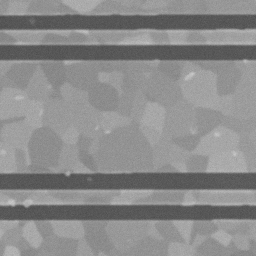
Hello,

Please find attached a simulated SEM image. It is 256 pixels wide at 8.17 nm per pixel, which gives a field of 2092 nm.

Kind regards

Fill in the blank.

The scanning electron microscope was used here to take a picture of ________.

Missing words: lines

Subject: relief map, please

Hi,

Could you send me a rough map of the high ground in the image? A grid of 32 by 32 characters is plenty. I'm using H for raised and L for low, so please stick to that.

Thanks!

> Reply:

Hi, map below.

HHHHHHHHHHHHHHHHHHHHHHHHHHHHHHHH
HHHHHHHHHHHHHHHHHHHHHHHHHHHHHHHH
LLLLLLLLLLLLLLLLLLLLLLLLLLLLLLLL
LLLLLLLLLLLLLLLLLLLLLLLLLLLLLLLL
HHHHHHHHHHHHHHHHHHHHHHHHHHHHHHHH
HHHHHHHHHHHHHHHHHHHHHHHHHHHHHHHH
LLLLLLLLLLLLLLLLLLLLLLLLLLLLLLLL
LLLLLLLLLLLLLLLLLLLLLLLLLLLLLLLL
HHHHHHHHHHHHHHHHHHHHHHHHHHHHHHHH
HHHHHHHHHHHHHHHHHHHHHHHHHHHHHHHH
HHHHHHHHHHHHHHHHHHHHHHHHHHHHHHHH
HHHHHHHHHHHHHHHHHHHHHHHHHHHHHHHH
HHHHHHHHHHHHHHHHHHHHHHHHHHHHHHHH
HHHHHHHHHHHHHHHHHHHHHHHHHHHHHHHH
HHHHHHHHHHHHHHHHHHHHHHHHHHHHHHHH
HHHHHHHHHHHHHHHHHHHHHHHHHHHHHHHH
HHHHHHHHHHHHHHHHHHHHHHHHHHHHHHHH
HHHHHHHHHHHHHHHHHHHHHHHHHHHHHHHH
HHHHHHHHHHHHHHHHHHHHHHHHHHHHHHHH
HHHHHHHHHHHHHHHHHHHHHHHHHHHHHHHH
HHHHHHHHHHHHHHHHHHHHHHHHHHHHHHHH
HHHHHHHHHHHHHHHHHLLLLLLLLLLLLLLL
LLLLLLLLLLLLLLLLLLLLLLLLLLLLLLLL
LLLLLLLLLLLLLLLLLLLLLLLLLLLLLLLL
HHHHHHHHHHHHHHHHHHHHHHHHHHHHHHHH
HHHHHHHHHHHHHHHHHHHHHHHHHHHHHHHH
LLLLLLLLLLLLLLLLLLLLLLLLLLLLLLLL
LLLLLLLLLLLLLLLLLLLLLLLLLLLLLLLL
HHHHHHHHHHHHHHHHHHHHHHHHHHHHHHHH
HHHHHHHHHHHHHHHHHHHHHHHHHHHHHHHH
HHHHHHHHHHHHHHHHHHHHHHHHHHHHHHHH
HHHHHHHHHHHHHHHHHHHHHHHHHHHHHHHH